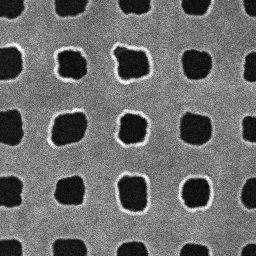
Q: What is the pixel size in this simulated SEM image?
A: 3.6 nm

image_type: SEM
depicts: a regular array of holes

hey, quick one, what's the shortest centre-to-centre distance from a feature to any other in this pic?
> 62.9 px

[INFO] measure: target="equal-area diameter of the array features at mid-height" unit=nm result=111